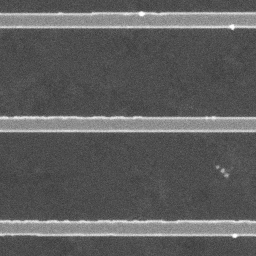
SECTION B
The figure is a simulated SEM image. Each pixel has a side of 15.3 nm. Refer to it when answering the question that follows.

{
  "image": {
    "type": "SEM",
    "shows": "lines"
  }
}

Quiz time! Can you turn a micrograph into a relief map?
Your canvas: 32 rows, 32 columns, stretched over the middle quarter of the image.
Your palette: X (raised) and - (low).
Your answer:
--------------------------------
--------------------------------
--------------------------------
--------------------------------
--------------------------------
--------------------------------
--------------------------------
--------------------------------
--------------------------------
--------------------------------
--------------------------------
--------------------------------
--------------------------------
XXXXXXXXXXXXXXXXXXXXXXXXXXXXXXXX
XXXXXXXXXXXXXXXXXXXXXXXXXXXXXXXX
XXXXXXXXXXXXXXXXXXXXXXXXXXXXXXXX
XXXXXXXXXXXXXXXXXXXXXXXXXXXXXXXX
--------------------------------
--------------------------------
--------------------------------
--------------------------------
--------------------------------
--------------------------------
--------------------------------
--------------------------------
--------------------------------
--------------------------------
--------------------------------
--------------------------------
--------------------------------
--------------------------------
--------------------------------